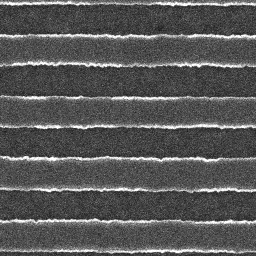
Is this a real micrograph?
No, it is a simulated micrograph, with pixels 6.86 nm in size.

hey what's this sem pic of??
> one or a few lines or trenches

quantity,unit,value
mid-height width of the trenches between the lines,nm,207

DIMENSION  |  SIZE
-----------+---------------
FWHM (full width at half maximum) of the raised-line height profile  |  215 nanometers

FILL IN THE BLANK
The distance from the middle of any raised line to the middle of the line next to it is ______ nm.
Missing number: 425